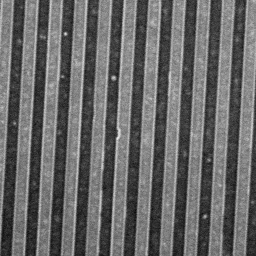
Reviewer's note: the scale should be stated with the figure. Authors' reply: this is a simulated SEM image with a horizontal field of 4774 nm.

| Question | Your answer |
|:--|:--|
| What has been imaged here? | parallel lines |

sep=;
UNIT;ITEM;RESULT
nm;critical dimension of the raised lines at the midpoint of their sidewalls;214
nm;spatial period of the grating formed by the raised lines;458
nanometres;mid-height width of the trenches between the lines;233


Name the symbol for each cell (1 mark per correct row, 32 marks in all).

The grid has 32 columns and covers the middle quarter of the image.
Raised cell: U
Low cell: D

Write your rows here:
DDUUUDDDUUUDDDUUUDDDUUUDDDDUUDDD
DDUUUDDDUUUDDDUUUDDDUUUDDDDUUDDD
DDUUDDDDUUUDDDUUUDDDUUUDDDDUUDDD
DDUUDDDDUUUDDDUUUDDDUUUDDDUUUDDD
DDUUDDDDUUUDDDUUUDDDUUUDDDUUUDDD
DDUUDDDDUUUDDDUUUDDDUUUDDDUUUDDD
DDUUDDDDUUUDDDUUUDDDUUUDDDUUUDDD
DDUUDDDDUUDDDDUUUDDDUUUDDDUUUDDD
DUUUDDDDUUDDDDUUUDDDUUUDDDUUUDDD
DUUUDDDDUUDDDDUUUDDDUUUDDDUUUDDD
DDUUDDDDUUDDDDUUUDDDUUUDDDUUUDDD
DDUUDDDDUUDDDDUUDDDDUUUDDDUUUDDD
DUUUDDDDUUDDDDUUDDDDUUUDDDUUUDDD
DUUUDDDUUUDDDDUUDDDDUUDDDDUUUDDD
DUUUDDDUUUDDDDUUDDDDUUDDDDUUUDDD
DUUUDDDUUUDDDDUUDDDDUUDDDDUUUDDD
DUUUDDDUUUDDDDUUDDDDUUDDDDUUDDDD
DUUUDDDUUUDDDDUUDDDUUUDDDDUUDDDD
DUUUDDDUUUDDDUUUDDDUUUDDDDUUDDDD
DUUUDDDUUUDDDUUUDDDUUUDDDDUUDDDD
DUUUDDDUUUDDDUUUDDDUUUDDDDUUDDDD
DUUDDDDUUUDDDUUUDDDUUUDDDDUUDDDD
DUUDDDDUUUDDDUUUDDDUUUDDDUUUDDDU
DUUDDDDUUUDDDUUUDDDUUUDDDUUUDDDU
DUUDDDDUUUDDDUUUDDDUUUDDDUUUDDDU
DUUDDDDUUDDDDUUUDDDUUUDDDUUUDDDU
DUUDDDDUUDDDDUUUDDDUUUDDDUUUDDDU
UUUDDDDUUDDDDUUUDDDUUUDDDUUUDDDU
UUUDDDDUUDDDDUUUDDDUUUDDDUUUDDDU
UUUDDDDUUDDDDUUUDDDUUUDDDUUUDDDU
UUUDDDDUUDDDDUUDDDDUUDDDDUUUDDDU
UUUDDDUUUDDDDUUDDDDUUDDDDUUUDDDU